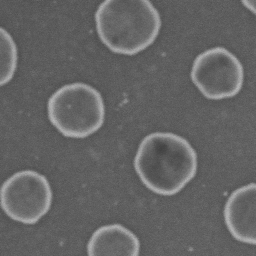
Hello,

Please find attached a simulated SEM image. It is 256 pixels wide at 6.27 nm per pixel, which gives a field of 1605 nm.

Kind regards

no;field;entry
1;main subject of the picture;raised bodies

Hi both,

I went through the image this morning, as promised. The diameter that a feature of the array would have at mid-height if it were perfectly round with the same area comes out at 324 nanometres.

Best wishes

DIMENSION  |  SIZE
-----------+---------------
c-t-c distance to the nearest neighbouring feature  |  638 nm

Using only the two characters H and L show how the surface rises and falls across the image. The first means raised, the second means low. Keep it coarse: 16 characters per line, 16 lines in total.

LLLLLLHHHHLLLLLL
LLLLLLHHHHLLLLLL
HLLLLLHHHLLLLLLL
HLLLLLLLLLLLLHHL
HLLLLLLLLLLLHHHL
LLLLHHLLLLLLHHHL
LLLHHHLLLLLLLLLL
LLLHHHLLLLLLLLLL
LLLLLLLLLHHLLLLL
LLLLLLLLLHHHLLLL
LLLLLLLLLHHHLLLL
HHHLLLLLLHHHLLLL
HHHLLLLLLLLLLLHH
LHHLLLLLLLLLLLHH
LLLLLLHHLLLLLLLH
LLLLLLHHHLLLLLLL